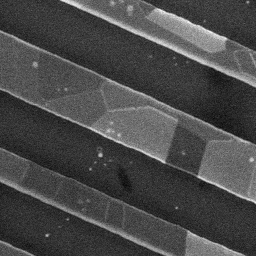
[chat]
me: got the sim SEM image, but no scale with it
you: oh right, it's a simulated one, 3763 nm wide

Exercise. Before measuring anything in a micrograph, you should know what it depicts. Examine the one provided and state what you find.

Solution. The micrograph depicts lines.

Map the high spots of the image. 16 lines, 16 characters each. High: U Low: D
DDDDDUUUUUDDDDDD
DDDDDDDUUUUUDDDD
UDDDDDDDDDUUUUDD
UUUUDDDDDDDDUUUU
UUUUUUDDDDDDDDUU
UUUUUUUUDDDDDDDD
DDUUUUUUUUDDDDDD
DDDDUUUUUUUUDDDD
DDDDDDDUUUUUUUUD
UDDDDDDDDUUUUUUU
UUUDDDDDDDDUUUUU
UUUUUDDDDDDDDUUU
DDDUUUUDDDDDDDDD
DDDDDUUUUUDDDDDD
DDDDDDDUUUUUDDDD
UDDDDDDDDUUUUUDD